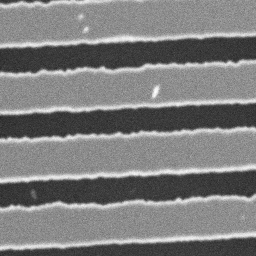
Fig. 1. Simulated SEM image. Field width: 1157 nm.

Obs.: lines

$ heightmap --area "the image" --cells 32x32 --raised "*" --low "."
.*******************************
********************************
********************************
********************************
*******************************.
**********......................
................................
................................
............*....***************
********************************
********************************
********************************
********************************
***************.................
................................
................................
......................**********
********************************
********************************
********************************
********************************
**************************.*....
******..........................
................................
................................
.......*...*..******************
********************************
********************************
********************************
********************************
*************...................
................................